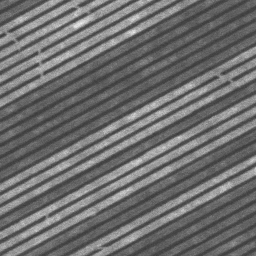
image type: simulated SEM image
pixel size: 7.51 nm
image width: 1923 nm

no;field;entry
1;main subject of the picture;parallel lines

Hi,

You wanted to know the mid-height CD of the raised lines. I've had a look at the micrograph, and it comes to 49.6 nanometres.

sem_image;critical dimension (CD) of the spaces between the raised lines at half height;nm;34.8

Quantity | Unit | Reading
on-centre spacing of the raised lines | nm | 79.8